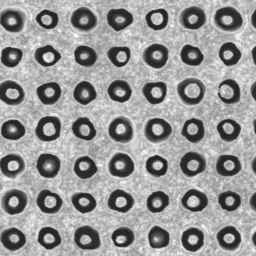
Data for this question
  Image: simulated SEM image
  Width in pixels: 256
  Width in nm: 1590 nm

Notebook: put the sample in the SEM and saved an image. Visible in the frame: a regular array of ring-shaped grooves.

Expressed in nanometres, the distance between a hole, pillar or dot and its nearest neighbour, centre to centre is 220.